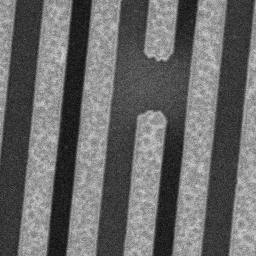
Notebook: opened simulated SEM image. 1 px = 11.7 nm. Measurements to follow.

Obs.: parallel lines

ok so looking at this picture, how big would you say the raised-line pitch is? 596 nm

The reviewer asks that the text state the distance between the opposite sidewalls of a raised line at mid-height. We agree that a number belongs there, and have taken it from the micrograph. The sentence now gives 338 nanometres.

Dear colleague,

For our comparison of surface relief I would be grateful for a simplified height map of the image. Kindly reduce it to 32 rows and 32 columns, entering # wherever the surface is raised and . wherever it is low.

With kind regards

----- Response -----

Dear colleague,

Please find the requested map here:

##...####...###....###...###....
##...####..####....###...###....
##...####..####...####..####....
##...####..####...####..####....
##...####..####...####..####...#
#....###...####...####..####...#
#....###...###....####..####...#
#....###...###..........####...#
#....###...###..........###....#
#....###...###..........###....#
#...####..####..........###....#
#...####..####..........###....#
#...####..####.........####....#
#...####..####.........####....#
#...####..####....##...####...##
....###...###....####..####...##
....###...###....####..####...##
....###...###....####..####...##
....###...###....###...###....##
....###...###....###...###....##
...####..####....###...###....##
...####..####....###...###....##
...####..####...####..####....##
...####..####...####..####....##
...####..####...####..####...###
...###...####...####..####...###
...###...###....####..####...###
...###...###....###...####...###
...###...###....###...###....###
...###...###....###...###....###
..####..####....###...###....###
..####..####....###...###....###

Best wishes